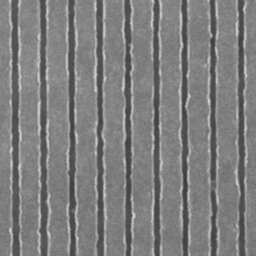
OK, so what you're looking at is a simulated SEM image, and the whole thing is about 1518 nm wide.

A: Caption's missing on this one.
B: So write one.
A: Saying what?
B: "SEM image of parallel lines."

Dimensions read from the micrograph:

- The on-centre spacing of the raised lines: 28.3 px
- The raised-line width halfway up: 130 nanometres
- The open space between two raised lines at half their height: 6.37 px